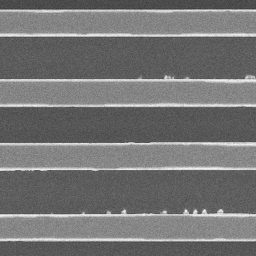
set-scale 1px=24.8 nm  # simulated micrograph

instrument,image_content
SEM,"lines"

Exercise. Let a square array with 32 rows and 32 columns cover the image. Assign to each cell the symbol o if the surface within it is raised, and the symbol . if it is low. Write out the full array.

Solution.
................................
oooooooooooooooooooooooooooooooo
oooooooooooooooooooooooooooooooo
oooooooooooooooooooooooooooooooo
................................
................................
................................
................................
................................
................................
oooooooooooooooooooooooooooooooo
oooooooooooooooooooooooooooooooo
oooooooooooooooooooooooooooooooo
................................
................................
................................
................................
................................
oooooooooooooooooooooooooooooooo
oooooooooooooooooooooooooooooooo
oooooooooooooooooooooooooooooooo
................................
................................
................................
................................
................................
................................
oooooooooooooooooooooooooooooooo
oooooooooooooooooooooooooooooooo
oooooooooooooooooooooooooooooooo
................................
................................